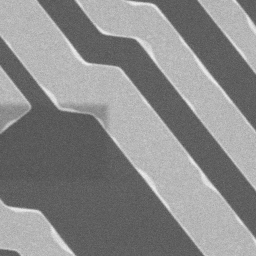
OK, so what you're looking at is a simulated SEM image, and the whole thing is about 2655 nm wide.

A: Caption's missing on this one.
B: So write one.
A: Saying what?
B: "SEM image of groups of lines, slits or small figures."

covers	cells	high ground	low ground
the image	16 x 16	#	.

###..#####...##.
###...#####...##
####.....##...##
.####.....##...#
..######..###...
#..######..###..
##..#####...###.
#.....####...##.
.......####..###
........####..##
.........###...#
.........####...
..........####..
###........####.
###.........####
####........####